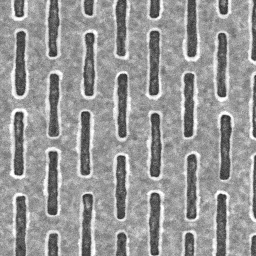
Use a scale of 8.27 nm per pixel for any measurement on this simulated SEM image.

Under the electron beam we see a regular array of holes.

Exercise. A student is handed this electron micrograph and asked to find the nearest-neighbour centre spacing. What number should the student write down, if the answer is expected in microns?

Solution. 0.426